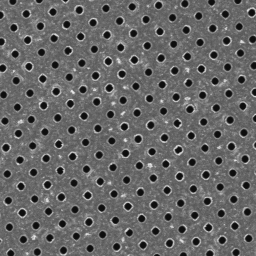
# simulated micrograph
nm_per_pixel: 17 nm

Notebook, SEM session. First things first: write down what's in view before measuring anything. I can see a regular array of holes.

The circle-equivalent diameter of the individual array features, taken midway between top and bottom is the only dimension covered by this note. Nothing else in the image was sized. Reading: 122 nm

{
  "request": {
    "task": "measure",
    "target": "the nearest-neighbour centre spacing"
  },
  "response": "314 nm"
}